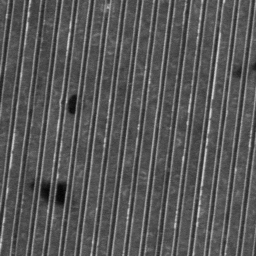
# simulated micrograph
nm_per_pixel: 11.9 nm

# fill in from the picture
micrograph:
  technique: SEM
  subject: parallel lines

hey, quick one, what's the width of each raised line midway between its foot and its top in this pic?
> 61.8 nm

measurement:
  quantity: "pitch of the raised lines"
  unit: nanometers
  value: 190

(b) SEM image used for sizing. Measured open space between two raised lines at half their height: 122 nanometres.